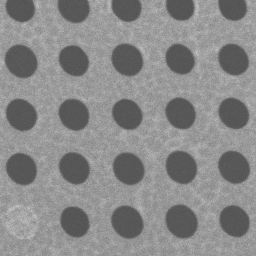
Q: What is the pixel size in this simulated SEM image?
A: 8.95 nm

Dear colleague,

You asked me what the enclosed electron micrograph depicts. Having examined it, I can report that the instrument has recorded a regular array of holes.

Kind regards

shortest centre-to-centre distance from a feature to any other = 52.8 pixels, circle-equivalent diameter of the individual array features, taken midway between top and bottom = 278 nm